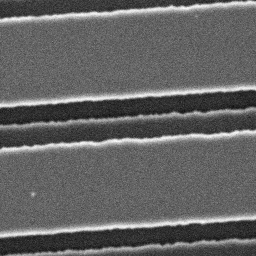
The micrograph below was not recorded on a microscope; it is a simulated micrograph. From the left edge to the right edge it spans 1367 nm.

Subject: lines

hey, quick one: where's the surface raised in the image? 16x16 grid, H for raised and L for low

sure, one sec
LLLLLLLLLLHHHHHH
HHHHHHHHHHHHHHHH
HHHHHHHHHHHHHHHH
HHHHHHHHHHHHHHHH
HHHHHHHHHHHHHHHH
HHHHHHHHHHHHHHHH
HHHLLLLLLLLLLLLL
LLLLLLLLLLLLLLLL
LLLLLLLLLLLHHHHH
HHHHHHHHHHHHHHHH
HHHHHHHHHHHHHHHH
HHHHHHHHHHHHHHHH
HHHHHHHHHHHHHHHH
HHHHHHHHHHHHHHHH
HHHHLLLLLLLLLLLL
LLLLLLLLLLLLLLLL